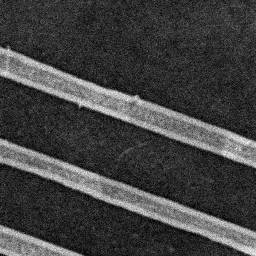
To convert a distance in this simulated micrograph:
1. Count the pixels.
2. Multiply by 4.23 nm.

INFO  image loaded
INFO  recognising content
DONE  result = one or a few lines or trenches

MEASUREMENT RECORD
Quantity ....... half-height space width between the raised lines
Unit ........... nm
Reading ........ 272